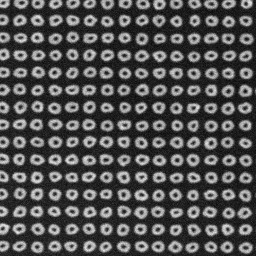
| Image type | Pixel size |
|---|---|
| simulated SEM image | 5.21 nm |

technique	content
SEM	a regular array of ring-shaped raised bodies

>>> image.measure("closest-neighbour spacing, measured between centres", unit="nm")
86.8